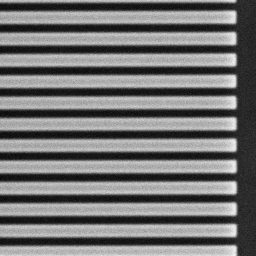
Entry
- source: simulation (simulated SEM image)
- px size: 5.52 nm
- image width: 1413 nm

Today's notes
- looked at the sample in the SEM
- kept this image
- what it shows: groups of lines, slits or small figures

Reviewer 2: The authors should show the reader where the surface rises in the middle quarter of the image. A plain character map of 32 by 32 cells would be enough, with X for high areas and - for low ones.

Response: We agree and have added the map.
XXXXXXXXXXXXXXXXXX--------------
--------------------------------
--------------------------------
XXXXXXXXXXXXXXXXXXXXXXXXXXXXXXXX
XXXXXXXXXXXXXXXXXXXXXXXXXXXXXXXX
XXXXXXXXXXXXXXXXXXXXXXXXXXXXXXXX
--------------------------------
--------------------------------
XXXXXXXXXXXXXXXXXXXXXXXXXXXXXXXX
XXXXXXXXXXXXXXXXXXXXXXXXXXXXXXXX
XXXXXXXXXXXXXXXXXXXXXXXXXXXXXXXX
--------------------------------
--------------------------------
--------------------------------
XXXXXXXXXXXXXXXXXXXXXXXXXXXXXXXX
XXXXXXXXXXXXXXXXXXXXXXXXXXXXXXXX
XXXXXXXXXXXXXX------------------
--------------------------------
--------------------------------
XXXXXXXXXXXXXXXXXXXXXXXXXXXXXXXX
XXXXXXXXXXXXXXXXXXXXXXXXXXXXXXXX
XXXXXXXXXXXXXXXXXXXXXXXXXXXXXXXX
--------------------------------
--------------------------------
XXXXXXXXXXXXXXXXXXXXXXXXXXXXXXXX
XXXXXXXXXXXXXXXXXXXXXXXXXXXXXXXX
XXXXXXXXXXXXXXXXXXXXXXXXXXXXXXXX
--------------------------------
--------------------------------
--------------------------------
XXXXXXXXXXXXXXXXXXXXXXXXXXXXXXXX
XXXXXXXXXXXXXXXXXXXXXXXXXXXXXXXX